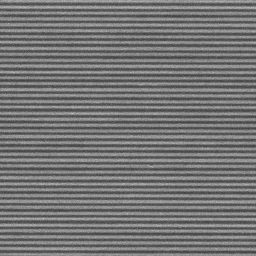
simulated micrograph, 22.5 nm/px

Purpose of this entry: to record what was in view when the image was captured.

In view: parallel lines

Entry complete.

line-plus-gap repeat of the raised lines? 132 nanometers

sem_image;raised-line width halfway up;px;2.37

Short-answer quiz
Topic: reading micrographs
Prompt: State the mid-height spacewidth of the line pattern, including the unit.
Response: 0.09 micrometres